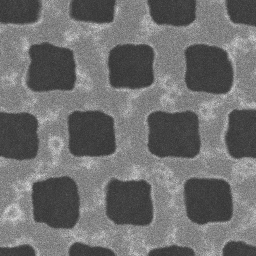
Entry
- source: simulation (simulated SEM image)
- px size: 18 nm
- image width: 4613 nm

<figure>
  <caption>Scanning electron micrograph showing a regular array of holes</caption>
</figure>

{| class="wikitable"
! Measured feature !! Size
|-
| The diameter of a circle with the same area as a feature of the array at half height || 932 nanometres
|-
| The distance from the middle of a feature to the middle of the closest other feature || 1330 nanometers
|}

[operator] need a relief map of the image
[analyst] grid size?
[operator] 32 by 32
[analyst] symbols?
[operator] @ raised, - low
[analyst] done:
-----@@@@-----@@@@-------@@@----
-----@@@@-----@@@@@------@@@----
-----@@@@-----@@@@@-----@@@@@---
@@@@@@@@@@@@@@@@@@@@@@@@@@@@@@@@
@@@@@@@@@@@@@@@@@@@@@@@@@@@@@@@@
@@@@@--@@@@@@@@-@@@@@@@@--@@@@@@
@@@@-----@@@@@-----@@@@-----@@@@
@@@@-----@@@@------@@@@------@@@
@@@------@@@@@-----@@@@------@@@
@@@------@@@@@-----@@@@------@@@
@@@------@@@@@-----@@@@------@@@
@@@@--@@@@@@@@@@@@@@@@@@@----@@@
@@@@@@@@@@@@@@@@@@@@@@@@@@@@@@@@
@@@@@@@@@@@@@@@@@@@@@@@@@@@@@@@@
----@@@@@-----@@@@@------@@@@---
-----@@@------@@@@-------@@@----
-----@@@@-----@@@@@------@@@----
-----@@@@-----@@@@@------@@@----
-----@@@@------@@@@------@@@----
----@@@@@----@@@@@@@-----@@@@---
@@@@@@@@@@@@@@@@@@@@@@@@@@@@@@@@
@@@@@@@@@@@@@@@@@@@@@@@@@@@@@@@@
@@@@@@---@@@@@-@@@@@@@@-----@@@@
@@@@------@@@------@@@@------@@@
@@@@------@@@------@@@@------@@@
@@@@------@@@------@@@@------@@@
@@@@------@@@------@@@@------@@@
@@@@------@@@@-----@@@@@-----@@@
@@@@@@@--@@@@@@@@@@@@@@@@@@@@@@@
@@@@@@@@@@@@@@@@@@@@@@@@@@@@@@@@
@@@@@@@@@--@@@@@@@@@@@@@@@@@---@
----@@@@@-----@@@@@-----@@@@----